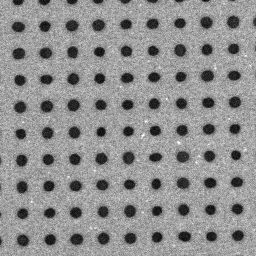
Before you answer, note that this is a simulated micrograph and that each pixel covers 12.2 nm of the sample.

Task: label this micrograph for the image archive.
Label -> a regular array of holes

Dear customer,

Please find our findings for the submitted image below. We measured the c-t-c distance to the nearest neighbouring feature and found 322 nm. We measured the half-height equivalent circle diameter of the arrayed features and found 0.137 microns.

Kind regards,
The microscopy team